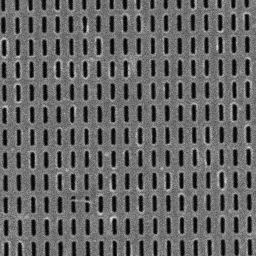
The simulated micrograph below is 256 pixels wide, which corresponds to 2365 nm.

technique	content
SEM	a regular array of holes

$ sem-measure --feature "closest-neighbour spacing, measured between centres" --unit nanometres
123